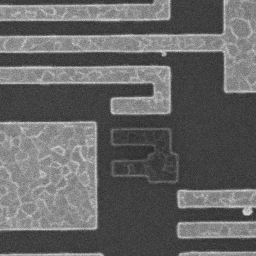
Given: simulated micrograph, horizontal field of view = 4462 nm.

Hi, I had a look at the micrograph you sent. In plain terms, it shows wiring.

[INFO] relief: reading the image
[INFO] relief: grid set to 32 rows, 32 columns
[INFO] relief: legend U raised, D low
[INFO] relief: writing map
DDDDDDDDDDDDDDDDDDDUUDDDDDDDUUUU
UUUUUUUUUUUUUUUUUUUUUDDDDDDDUUUU
UUUUUUUUUUUUUUUUUUDDDDDDDDDDUUUU
DDDDDDDDDDDDDDDDDDDDDDDDDDDDUUUU
DDDDDDDDDDDDDDDUUUUUUUUUUUUUUUUU
UUUUUUUUUUUUUUUUUUUUUUUUUUUUUUUU
UUUUUDDDDDDDDDDDDDDDDDDDDDDDUUUU
DDDDDDDDDDDDDDDDDDDDDDDDDDDDUUUU
DDUUUUUUUUUUUUUUUUUUUDDDDDDDUUUU
UUUUUUUUUUUUUUUUUUUUUDDDDDDDUUUU
DDDDDDDDDDDDDDDDDDDUUDDDDDDDUUUU
DDDDDDDDDDDDDDDDDDDUUDDDDDDDUUUD
DDDDDDDDDDDDDDUUUUUUUDDDDDDDDDDD
DDDDDDDDDDDDDDUUUUUUUDDDDDDDDDDD
DDDDDDDDDDDDDDDDDDDDDDDDDDDDDDDD
UUUUUUUUUUUUDDDDDDDDDDDDDDDDDDDD
UUUUUUUUUUUUDDUUUUUUUDDDDDDDDDDD
UUUUUUUUUUUUDDUUUUUUUDDDDDDDDDDD
UUUUUUUUUUUUDDDDDDDUUDDDDDDDDDDD
UUUUUUUUUUUUDDDDDDDUUUDDDDDDDDDD
UUUUUUUUUUUUDDUUUUUUUUDDDDDDDDDD
UUUUUUUUUUUUDDUUUUUUUUDDDDDDDDDD
UUUUUUUUUUUUDDDDDDDUUUDDDDDDDDDD
UUUUUUUUUUUUDDDDDDDDDDDDDDDDDDDD
UUUUUUUUUUUUDDDDDDDDDDUUUUUUUUUU
UUUUUUUUUUUUDDDDDDDDDDUUUUUUUUUU
UUUUUUUUUUUUDDDDDDDDDDDDDDDDDDDD
UUUUUUUUUUUUDDDDDDDDDDDDDDDDDDDD
UUUUUUUUUUUUDDDDDDDDDDUUUUUUUUUU
DDDDDDDDDDDDDDDDDDDDDDUUUUUUUUUU
DDDDDDDDDDDDDDDDDDDDDDDDDDDDDDDD
DDDDDDDDDDDDDDDDDDDDDDDDDDDDDDDD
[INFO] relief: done